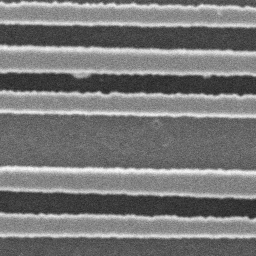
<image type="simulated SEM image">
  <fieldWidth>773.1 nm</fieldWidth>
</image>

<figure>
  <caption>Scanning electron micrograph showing lines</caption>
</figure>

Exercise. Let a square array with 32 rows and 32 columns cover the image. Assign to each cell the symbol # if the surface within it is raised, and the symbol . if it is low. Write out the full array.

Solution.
##########..#...#...............
################################
################################
................................
................................
................................
################################
################################
################################
............................#...
................................
##..............................
################################
################################
.....................#..########
................................
................................
................................
................................
................................
................................
################################
################################
################################
.......................#########
................................
................................
################################
################################
################################
................................
................................